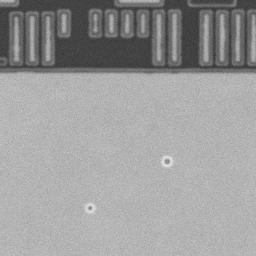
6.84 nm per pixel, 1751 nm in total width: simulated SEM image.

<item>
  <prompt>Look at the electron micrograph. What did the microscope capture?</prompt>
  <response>wiring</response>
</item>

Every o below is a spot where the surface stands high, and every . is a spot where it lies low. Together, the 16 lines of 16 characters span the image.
.......ooo..ooo.
.ooo..ooooo..ooo
.oo......oo..ooo
.oo.......o..ooo
oooooooooooooooo
oooooooooooooooo
oooooooooooooooo
oooooooooooooooo
oooooooooooooooo
oooooooooooooooo
oooooooooooooooo
oooooooooooooooo
oooooooooooooooo
oooooooooooooooo
oooooooooooooooo
oooooooooooooooo